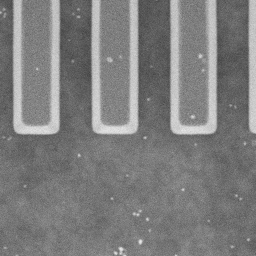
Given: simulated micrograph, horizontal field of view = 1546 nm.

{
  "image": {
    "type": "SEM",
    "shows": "wiring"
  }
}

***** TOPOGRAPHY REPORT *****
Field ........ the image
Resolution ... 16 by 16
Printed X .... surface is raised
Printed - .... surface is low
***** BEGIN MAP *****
-XX---XX---XX---
-XX---XX---XX---
-XX---XX---XX---
-XX---XX---XX---
-XX---XX---XX---
-XX---XX---XX---
-XX---XX---XX---
-XX---XX---XX---
----------------
----------------
----------------
----------------
----------------
----------------
----------------
----------------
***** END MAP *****